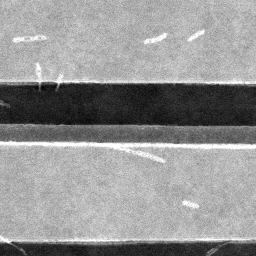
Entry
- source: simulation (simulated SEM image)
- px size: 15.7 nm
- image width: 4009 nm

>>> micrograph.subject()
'lines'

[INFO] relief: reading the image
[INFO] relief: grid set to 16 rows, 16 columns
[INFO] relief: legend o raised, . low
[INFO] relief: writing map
oooooooooooooooo
oooooooooooooooo
oooooooooooooooo
oooooooooooooooo
oooooooooooooooo
................
................
................
oooooooooooooooo
oooooooooooooooo
oooooooooooooooo
oooooooooooooooo
oooooooooooooooo
oooooooooooooooo
oooooooooooooooo
................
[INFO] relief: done